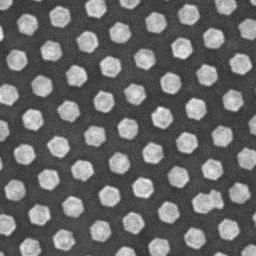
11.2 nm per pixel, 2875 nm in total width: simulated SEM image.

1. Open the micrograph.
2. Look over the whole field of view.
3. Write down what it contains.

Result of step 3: a regular array of raised bodies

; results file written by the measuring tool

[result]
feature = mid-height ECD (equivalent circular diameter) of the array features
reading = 216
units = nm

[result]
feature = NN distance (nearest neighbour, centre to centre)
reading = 388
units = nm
